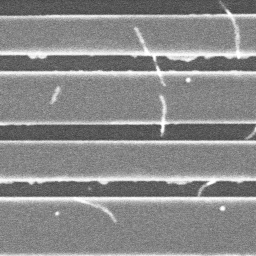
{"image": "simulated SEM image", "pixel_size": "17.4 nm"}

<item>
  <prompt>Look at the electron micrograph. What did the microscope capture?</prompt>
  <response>lines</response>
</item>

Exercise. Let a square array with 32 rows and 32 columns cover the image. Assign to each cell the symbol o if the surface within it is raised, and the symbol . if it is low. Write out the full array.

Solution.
................................
................................
oooooooooooooooooooooooooooooooo
oooooooooooooooooooooooooooooooo
oooooooooooooooooooooooooooooooo
oooooooooooooooooooooooooooooooo
oooooooooooooooooooooooooooooooo
................................
................................
oooooooooooooooooooooooooooooooo
oooooooooooooooooooooooooooooooo
oooooooooooooooooooooooooooooooo
oooooooooooooooooooooooooooooooo
oooooooooooooooooooooooooooooooo
oooooooooooooooooooooooooooooooo
o..o................o...........
................................
................................
oooooooooooooooooooooooooooooooo
oooooooooooooooooooooooooooooooo
oooooooooooooooooooooooooooooooo
oooooooooooooooooooooooooooooooo
oooooooooooooooooooooooooooooooo
................................
................................
oooooooooooooooooooooooooooooooo
oooooooooooooooooooooooooooooooo
oooooooooooooooooooooooooooooooo
oooooooooooooooooooooooooooooooo
oooooooooooooooooooooooooooooooo
oooooooooooooooooooooooooooooooo
oooooooooooooooooooooooooooooooo